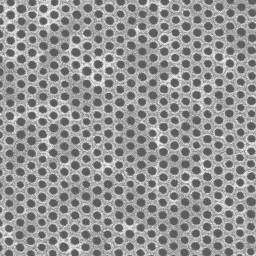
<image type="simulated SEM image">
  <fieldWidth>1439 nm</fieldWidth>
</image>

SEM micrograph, a regular array of holes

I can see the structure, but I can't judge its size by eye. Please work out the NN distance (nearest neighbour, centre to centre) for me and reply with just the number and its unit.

69.3 nm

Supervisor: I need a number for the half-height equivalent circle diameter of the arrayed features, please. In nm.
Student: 46.1